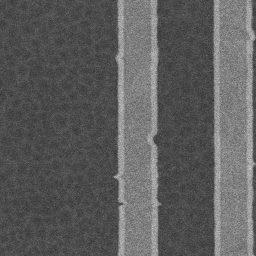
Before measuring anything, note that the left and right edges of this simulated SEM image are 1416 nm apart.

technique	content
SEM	one or a few lines or trenches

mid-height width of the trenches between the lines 351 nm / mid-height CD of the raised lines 178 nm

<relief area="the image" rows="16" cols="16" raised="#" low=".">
........##....##
........##....##
........##....##
.......###....##
........##....##
........##....##
........##....##
........##....##
........##....##
........##....##
........##....##
........##....##
........##....##
........##....##
........##....##
........##....##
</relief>